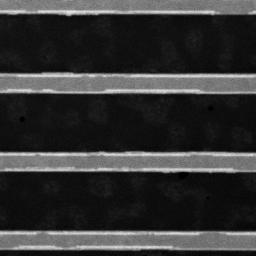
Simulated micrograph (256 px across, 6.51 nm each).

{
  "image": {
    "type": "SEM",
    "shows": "one or a few lines or trenches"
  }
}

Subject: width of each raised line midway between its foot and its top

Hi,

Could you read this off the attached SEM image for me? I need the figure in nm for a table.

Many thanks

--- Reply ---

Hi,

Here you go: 122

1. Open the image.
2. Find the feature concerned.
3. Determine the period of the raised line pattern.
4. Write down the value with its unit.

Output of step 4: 511 nm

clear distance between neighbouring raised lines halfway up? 390 nm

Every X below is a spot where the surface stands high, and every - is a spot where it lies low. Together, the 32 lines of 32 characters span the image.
XXXXXXXXXXXXXXXXXXXXXXXXXXXXXXXX
XXXXXXXXXXXXXXXXXXXXXXXXXXXXXXXX
--------------------------------
--------------------------------
--------------------------------
--------------------------------
--------------------------------
--------------------------------
--------------------------------
XXXXXXXXXXXXXXXXXXXXXXXXXXXXXXXX
XXXXXXXXXXXXXXXXXXXXXXXXXXXXXXXX
---X-----XXXXXXXXXXXXXXXXXXXXXXX
--------------------------------
--------------------------------
--------------------------------
--------------------------------
--------------------------------
--------------------------------
--------------------------------
XXXXXXXXXXXXXXXXXXXXXXXXXXXXXXXX
XXXXXXXXXXXXXXXXXXXXXXXXXXXXXXXX
--------------------------X-XX--
--------------------------------
--------------------------------
--------------------------------
--------------------------------
--------------------------------
--------------------------------
--------------------------------
XXXXXXXXXXXXXXXXXXXXXXXXXXXXXXXX
XXXXXXXXXXXXXXXXXXXXXXXXXXXXXXXX
--------------------------------